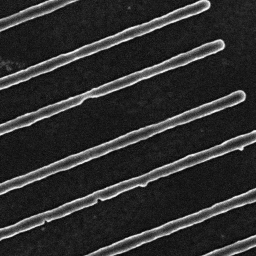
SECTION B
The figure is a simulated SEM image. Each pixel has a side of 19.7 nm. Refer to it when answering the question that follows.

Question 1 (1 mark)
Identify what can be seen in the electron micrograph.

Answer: parallel lines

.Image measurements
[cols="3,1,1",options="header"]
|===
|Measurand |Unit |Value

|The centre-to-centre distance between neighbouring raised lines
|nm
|954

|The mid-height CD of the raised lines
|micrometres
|0.202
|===